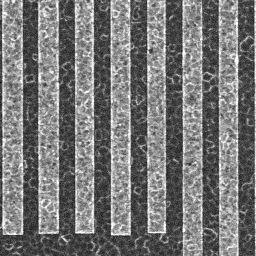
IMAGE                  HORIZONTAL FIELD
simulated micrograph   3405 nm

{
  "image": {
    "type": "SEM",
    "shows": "parallel lines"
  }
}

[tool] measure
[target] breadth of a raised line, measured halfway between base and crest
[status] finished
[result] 241 nm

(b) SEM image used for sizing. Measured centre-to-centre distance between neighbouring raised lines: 0.478 um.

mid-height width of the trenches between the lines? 233 nanometers